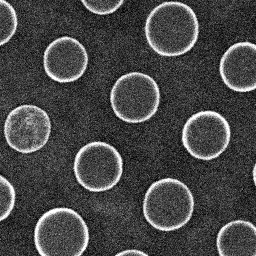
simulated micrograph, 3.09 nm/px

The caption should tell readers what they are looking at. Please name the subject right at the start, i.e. raised bodies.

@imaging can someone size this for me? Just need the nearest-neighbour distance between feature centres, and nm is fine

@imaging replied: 243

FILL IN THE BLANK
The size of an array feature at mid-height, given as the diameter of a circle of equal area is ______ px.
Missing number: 48.4